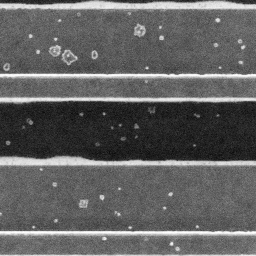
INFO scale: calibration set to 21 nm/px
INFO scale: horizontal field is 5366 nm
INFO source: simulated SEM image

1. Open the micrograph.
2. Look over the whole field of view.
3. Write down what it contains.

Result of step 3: lines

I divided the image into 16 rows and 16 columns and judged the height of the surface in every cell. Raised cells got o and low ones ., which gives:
oooooooooooooooo
oooooooooooooooo
oooooooooooooooo
oooooooooooooooo
oooooooooooooooo
oooooooooooooooo
................
................
................
................
oooooooooooooooo
oooooooooooooooo
oooooooooooooooo
oooooooooooooooo
oooooooooooooooo
oooooooooooooooo